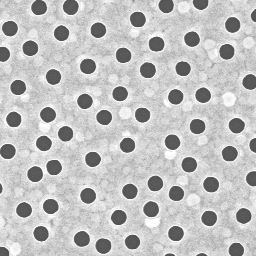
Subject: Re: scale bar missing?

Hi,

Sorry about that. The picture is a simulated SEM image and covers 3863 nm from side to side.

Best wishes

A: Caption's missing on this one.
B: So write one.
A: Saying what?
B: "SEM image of a regular array of holes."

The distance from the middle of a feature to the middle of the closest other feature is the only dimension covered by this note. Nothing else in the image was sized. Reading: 426 nanometres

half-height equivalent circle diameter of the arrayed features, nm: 240